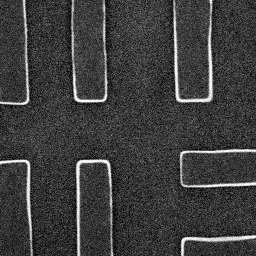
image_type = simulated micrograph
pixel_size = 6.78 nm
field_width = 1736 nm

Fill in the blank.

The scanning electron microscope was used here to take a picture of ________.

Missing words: groups of lines, slits or small figures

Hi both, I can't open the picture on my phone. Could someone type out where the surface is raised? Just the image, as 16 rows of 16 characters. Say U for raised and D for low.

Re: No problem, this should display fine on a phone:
UUDDDUUDDDDUUDDD
UUDDDUUDDDDUUDDD
UUDDDUUDDDDUUDDD
UUDDDUUDDDDUUDDD
UUDDDUUDDDDUUDDD
UUDDDUUDDDDUUDDD
DDDDDDDDDDDDDDDD
DDDDDDDDDDDDDDDD
DDDDDDDDDDDDDDDD
DDDDDDDDDDDDDUUU
UUDDDUUDDDDUUUUU
UUDDDUUDDDDDUUUD
UUDDDUUDDDDDDDDD
UUDDDUUDDDDDDDDD
UUDDDUUDDDDDDDDD
UUDDDUUDDDDUUUUU